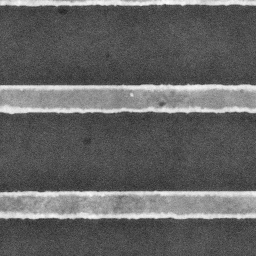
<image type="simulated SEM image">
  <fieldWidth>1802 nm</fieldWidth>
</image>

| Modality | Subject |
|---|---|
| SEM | lines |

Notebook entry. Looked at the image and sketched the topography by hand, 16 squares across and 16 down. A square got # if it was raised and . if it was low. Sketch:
................
................
................
................
................
################
################
................
................
................
................
................
################
################
................
................